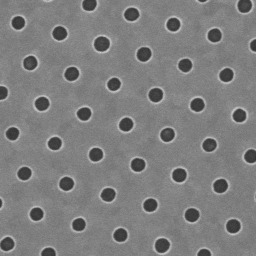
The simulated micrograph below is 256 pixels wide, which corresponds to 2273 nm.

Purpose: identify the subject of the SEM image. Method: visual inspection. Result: a regular array of holes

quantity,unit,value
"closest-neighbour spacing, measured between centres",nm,372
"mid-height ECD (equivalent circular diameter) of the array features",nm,133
